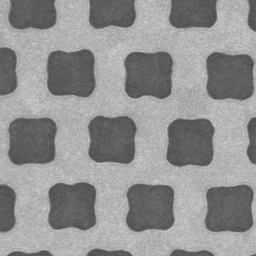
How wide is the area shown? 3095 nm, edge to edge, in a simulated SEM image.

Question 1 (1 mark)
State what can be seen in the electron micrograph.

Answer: a regular array of holes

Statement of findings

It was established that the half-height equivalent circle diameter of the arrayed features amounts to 620 nm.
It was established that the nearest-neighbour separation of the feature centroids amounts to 926 nm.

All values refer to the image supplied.